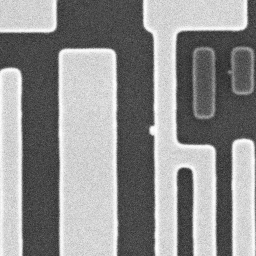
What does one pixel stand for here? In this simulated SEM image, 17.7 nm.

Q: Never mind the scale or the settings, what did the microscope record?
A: wiring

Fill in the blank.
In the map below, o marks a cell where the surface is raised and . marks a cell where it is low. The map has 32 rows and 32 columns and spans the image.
ooooooo...........ooooooooooooo.
ooooooo...........ooooooooooooo.
ooooooo...........ooooooooooooo.
ooooooo...........oooooooooooo..
...................ooo..........
...................ooo..........
........oooooo.....ooo..ooo..ooo
.......ooooooo.....ooo..ooo..ooo
.......ooooooo.....ooo..ooo..ooo
ooo....ooooooo.....ooo..ooo..ooo
ooo....ooooooo.....ooo..ooo..ooo
ooo....ooooooo.....ooo..ooo..oo.
oo.....ooooooo.....ooo..ooo.....
oo.....ooooooo.....ooo..ooo.....
ooo....ooooooo.....ooo...o......
ooo....ooooooo.....ooo..........
ooo....ooooooo.....ooo..........
ooo....ooooooo.....ooo........o.
ooo.....oooooo.....oooooooo..ooo
ooo.....oooooo.....oooooooo..ooo
ooo.....oooooo.....oooooooo..ooo
ooo.....oooooo.....ooo..ooo..ooo
ooo.....oooooo.....ooo..ooo..ooo
ooo.....oooooo.....ooo..ooo..ooo
ooo.....oooooo.....ooo..ooo..ooo
ooo.....oooooo.....ooo..ooo..ooo
ooo.....oooooo.....ooo..ooo..ooo
ooo.....ooooooo....ooo..ooo..ooo
ooo.....ooooooo.....oo..ooo..ooo
ooo.....ooooooo....ooo..ooo..ooo
ooo.....oooooo.....ooo..ooo..ooo
ooo.....oooooo.....ooo..ooo..ooo